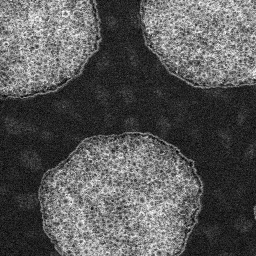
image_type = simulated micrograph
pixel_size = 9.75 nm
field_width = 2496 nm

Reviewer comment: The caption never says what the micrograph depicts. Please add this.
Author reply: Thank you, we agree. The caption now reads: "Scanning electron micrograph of holes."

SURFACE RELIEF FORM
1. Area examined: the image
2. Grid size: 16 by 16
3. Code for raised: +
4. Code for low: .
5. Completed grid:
......+++.......
......+++.......
......+++.......
......++++......
.....++++++.....
....++++++++++++
++++++++++++++++
++++++++++++++++
++++++....++++++
+++++......+++++
+++.........++++
+++..........+++
+++.........++++
+++.........++++
+++.........++++
++++.......+++++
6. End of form